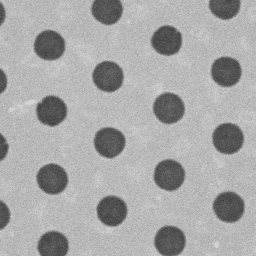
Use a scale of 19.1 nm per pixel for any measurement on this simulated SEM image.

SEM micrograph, a regular array of holes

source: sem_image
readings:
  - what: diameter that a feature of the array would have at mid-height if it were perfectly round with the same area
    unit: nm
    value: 606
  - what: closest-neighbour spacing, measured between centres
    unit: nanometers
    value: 1270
